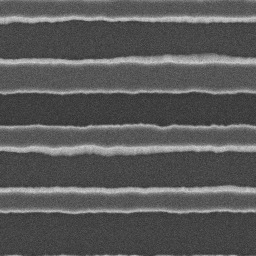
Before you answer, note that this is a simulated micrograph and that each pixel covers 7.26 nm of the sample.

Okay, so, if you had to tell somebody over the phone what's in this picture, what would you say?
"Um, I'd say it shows lines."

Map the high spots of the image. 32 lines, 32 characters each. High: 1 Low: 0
11111111111111111111111111111111
11111111111111111111111111111111
10010000000000000000000000000000
00000000000000000000000000000000
00000000000000000000000000000000
00000000000000000000000000000000
00000000000000000000000000000000
00000000000000001000110001110000
11111111111111111111111111111111
11111111111111111111111111111111
11111111111111111111111111111111
11000011110000011100011000111000
00000000000000000000000000000000
00000000000000000000000000000000
00000000000000000000000000000000
00000000000000000000000000000000
11111111111111111111111111111111
11111111111111111111111111111111
11111111111111111111111111111111
00000000000000000000000000000000
00000000000000000000000000000000
00000000000000000000000000000000
00000000000000000000000000000000
00000000000000000000000000000000
11111111111111111111111111111111
11111111111111111111111111111111
00000000110000000000000000000000
00000000000000000000000000000000
00000000000000000000000000000000
00000000000000000000000000000000
00000000000000000000000000000000
00000000000000000000000000000000